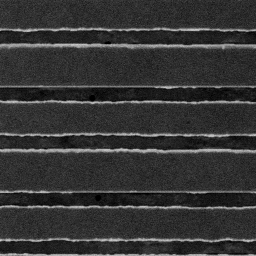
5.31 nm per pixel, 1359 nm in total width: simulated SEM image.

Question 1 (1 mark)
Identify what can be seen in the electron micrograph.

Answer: lines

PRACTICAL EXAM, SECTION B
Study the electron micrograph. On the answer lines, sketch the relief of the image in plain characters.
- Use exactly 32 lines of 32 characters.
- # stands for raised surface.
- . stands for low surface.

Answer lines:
################################
################################
################################
################################
................................
................................
################################
################################
################################
################################
################################
................................
................................
################################
################################
################################
################################
................................
................................
################################
################################
################################
################################
################################
................................
................................
################################
################################
################################
################################
................................
................................